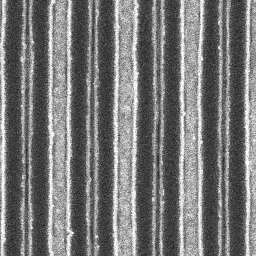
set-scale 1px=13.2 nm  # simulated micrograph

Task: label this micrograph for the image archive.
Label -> parallel lines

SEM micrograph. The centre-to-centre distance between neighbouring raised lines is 0.423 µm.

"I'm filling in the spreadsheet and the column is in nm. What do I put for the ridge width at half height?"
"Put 295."